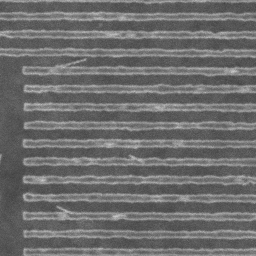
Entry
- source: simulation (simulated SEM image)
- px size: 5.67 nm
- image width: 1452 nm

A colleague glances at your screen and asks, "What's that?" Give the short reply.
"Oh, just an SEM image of parallel lines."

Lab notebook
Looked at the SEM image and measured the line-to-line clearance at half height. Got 65.9 nm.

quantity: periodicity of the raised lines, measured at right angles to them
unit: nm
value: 103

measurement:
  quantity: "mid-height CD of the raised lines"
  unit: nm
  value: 39